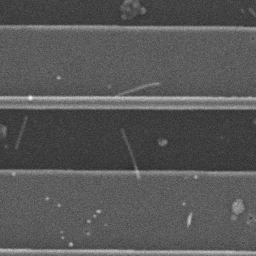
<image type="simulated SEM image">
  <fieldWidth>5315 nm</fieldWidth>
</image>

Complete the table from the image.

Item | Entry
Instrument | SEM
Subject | lines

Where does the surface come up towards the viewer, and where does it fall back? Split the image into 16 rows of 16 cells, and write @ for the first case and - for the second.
----------------
----------------
@@@@@@@@@@@@@@@@
@@@@@@@@@@@@@@@@
@@@@@@@@@@@@@@@@
@@@@@@@@@@@@@@@@
@@@@@@@@@@@@@@@@
----------------
----------------
----------------
----------------
@@@@@@@@@@@@@@@@
@@@@@@@@@@@@@@@@
@@@@@@@@@@@@@@@@
@@@@@@@@@@@@@@@@
@@@@@@@@@@@@@@@@